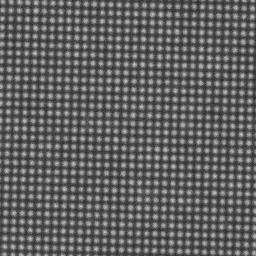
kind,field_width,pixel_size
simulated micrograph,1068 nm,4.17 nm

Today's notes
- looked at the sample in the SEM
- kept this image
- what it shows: a regular array of raised bodies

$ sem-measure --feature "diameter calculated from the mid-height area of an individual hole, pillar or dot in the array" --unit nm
18.2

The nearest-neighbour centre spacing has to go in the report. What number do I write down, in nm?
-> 33.2